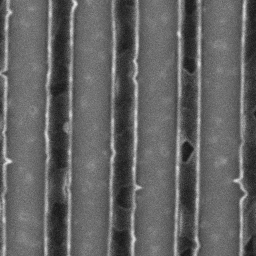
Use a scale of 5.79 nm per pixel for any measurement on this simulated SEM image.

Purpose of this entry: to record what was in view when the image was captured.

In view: one or a few lines or trenches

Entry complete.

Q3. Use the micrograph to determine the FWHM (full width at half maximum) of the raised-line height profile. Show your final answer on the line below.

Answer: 146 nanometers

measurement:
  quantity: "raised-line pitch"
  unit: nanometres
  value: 374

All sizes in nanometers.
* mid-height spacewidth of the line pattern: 234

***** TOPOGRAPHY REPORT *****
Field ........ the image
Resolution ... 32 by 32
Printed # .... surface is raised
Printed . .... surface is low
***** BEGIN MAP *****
#.....####....###.....#.#.....##
#.....###.....###.....#.#.....##
#.....###.....###.....###.....##
#.....###.....###.....###.....##
#.....###.....###.....###.....##
#.....###.....###.....###.....##
#.....###.....###.....###.....##
#.....###.....###.....###.....##
#.....###.....###.....###.....##
#.....###.....###.....###.....##
#.....###.....###.....###.....##
#.....###.....###.....###.....##
#.....###.....###.....###.....##
#.....###.....###.....###.....##
#.....###.....###.....###.....##
#.....###.....###.....###.....##
#.....###.....###.....###.....##
#.....###.....###.....###.....##
#.....###.....###.....#.#.....##
#.....###.....###.....#.#.....##
#.....###.....###.....###.....##
#.....###.....###.....###.....##
#.....###.....###.....###.....##
#.....###.....###.....###.....##
......###.....###.....###.....##
#.....###.....###.....###.....##
#.....###.....###.....###.....##
#.....###.....###.....###.....##
#.....###.....###.....###.....##
#.....###.....###.....###.....##
#.....###.....###.....###.....##
#.....###.....###.....#.#.....##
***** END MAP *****